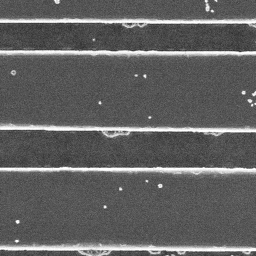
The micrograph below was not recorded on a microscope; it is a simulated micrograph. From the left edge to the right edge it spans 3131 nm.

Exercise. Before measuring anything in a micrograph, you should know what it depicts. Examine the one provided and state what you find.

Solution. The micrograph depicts lines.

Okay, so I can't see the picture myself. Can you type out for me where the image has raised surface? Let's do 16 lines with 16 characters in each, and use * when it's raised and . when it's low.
****************
................
................
****************
****************
****************
****************
****************
................
................
................
****************
****************
****************
****************
****************